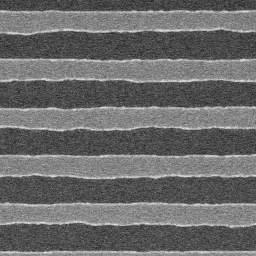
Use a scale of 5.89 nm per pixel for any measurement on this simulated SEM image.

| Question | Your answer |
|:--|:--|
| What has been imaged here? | lines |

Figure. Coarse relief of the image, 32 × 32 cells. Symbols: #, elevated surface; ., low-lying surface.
................................
##...###........#.#.############
################################
################################
................................
................................
................................
############....##.#####......##
################################
################################
................................
................................
................................
............####..##.#...#######
################################
################################
................................
................................
................................
##########..########...####.####
################################
################################
................................
................................
................................
##.......###....#####...........
################################
################################
................................
................................
................................
###..############.##############